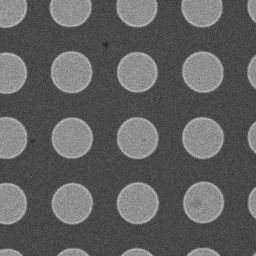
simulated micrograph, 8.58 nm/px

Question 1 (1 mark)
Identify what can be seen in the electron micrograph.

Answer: an array of small figures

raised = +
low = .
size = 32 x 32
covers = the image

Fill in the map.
+++...+++++....+++++...+++++...+
+++...+++++....+++++...+++++...+
+++....++++....++++....++++.....
................................
................................
................................
........++......................
+++....++++....++++....++++....+
+++...+++++....+++++...+++++...+
+++...+++++....+++++...+++++...+
+++....++++....++++....++++....+
++......++...............+......
................................
................................
................................
+++....++++....++++.....+++.....
+++....++++....+++++...+++++...+
+++....+++++...+++++...+++++...+
+++....++++....++++....+++++...+
++......++......++......+++.....
................................
................................
................................
++......+++.....+++.....+++.....
+++....++++....+++++...+++++...+
+++....+++++...+++++...+++++...+
+++....++++....+++++...+++++...+
++......++......+++.....+++.....
................................
................................
................................
++......+++.....+++.....+++.....